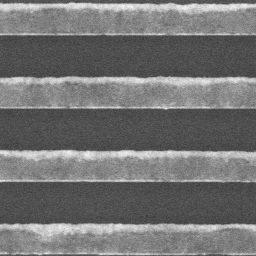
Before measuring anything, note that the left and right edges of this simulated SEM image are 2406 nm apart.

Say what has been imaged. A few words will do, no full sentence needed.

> lines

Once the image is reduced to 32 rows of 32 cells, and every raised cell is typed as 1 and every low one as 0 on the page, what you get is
00000000000000000000000000000000
11111111111111111111111111111111
11111111111111111111111111111111
11111111111111111111111111111111
00000000000000000000000000000000
00000000000000000000000000000000
00000000000000000000000000000000
00000000000000000000000000000000
00000000000000000000000000000000
00000000000000000000000000000000
11111111111111111111111111111111
11111111111111111111111111111111
11111111111111111111111111111111
00000000000000000000100000000000
00000000000000000000000000000000
00000000000000000000000000000000
00000000000000000000000000000000
00000000000000000000000000000000
00000000000000000000000000000000
11111111111111111111111111111111
11111111111111111111111111111111
11111111111111111111111111111111
11111111111111111111111111111111
00000000000000000000000000000000
00000000000000000000000000000000
00000000000000000000000000000000
00000000000000000000000000000000
00000000000000000000000000000000
11111111111111111111111111111111
11111111111111111111111111111111
11111111111111111111111111111111
11111111111111111111111111111111